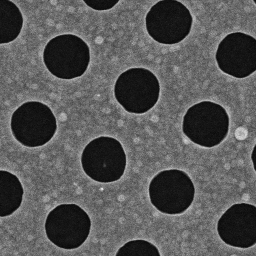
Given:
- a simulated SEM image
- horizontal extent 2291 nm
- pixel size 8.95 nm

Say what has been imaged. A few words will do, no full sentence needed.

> holes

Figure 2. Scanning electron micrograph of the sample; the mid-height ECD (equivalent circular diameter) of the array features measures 409 nm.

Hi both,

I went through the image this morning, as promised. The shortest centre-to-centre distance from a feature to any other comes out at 675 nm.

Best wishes